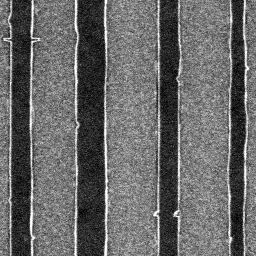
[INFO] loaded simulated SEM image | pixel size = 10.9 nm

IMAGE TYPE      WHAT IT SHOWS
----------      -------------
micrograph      one or a few lines or trenches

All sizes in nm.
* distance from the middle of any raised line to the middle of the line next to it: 788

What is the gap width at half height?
548 nanometers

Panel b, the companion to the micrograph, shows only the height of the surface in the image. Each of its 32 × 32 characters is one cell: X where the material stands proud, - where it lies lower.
-XXX------XXX-------XX-------XX-
-XXX------XXX-------XX-------XX-
-XXX-----XXXX-------XX-------XX-
-XXX------XXX-------XX-------XX-
-XXX------XXX-------XX-------XX-
-XXX------XXX-------XX-------XX-
-XXX------XXX-------XXX------XX-
-XXX-----XXXX-------XXX------XX-
-XXX-----XXXX-------XX-------XX-
-XXX-----XXXX-------XX-------XX-
-XXX------XXX-------XX-------XX-
-XXX------XXX-------XX-------XX-
-XXX------XXX-------XX-------XX-
-XXX------XXX-------XX-------XX-
-XXX------XXX-------XX-------XX-
-XXX------XXX-------XX-------XX-
-XXX------XXX-------XX-------XX-
-XXX------XXX-------XX-------XX-
-XXX------XXX-------XX-------XX-
-XXX------XXX-------XX-------XX-
-XXX------XXX-------XX-------XX-
-XXX------XXX-------XX-------XX-
-XXX------XXX-------XX-------XX-
-XXX------XXX-------XX-------XX-
-XXX------XXX-------XX-------XX-
-XXX------XXX-------XX-------XX-
-XXX------XXX-------XX-------X--
-XXX------XXX-------XX-------X--
-XXX------XXX-------XX-------X--
-XXX------XXX-------XX-------XX-
-XXX-----XXXX-------XX-------XX-
-XXX-----XXXX-------XX-------XX-